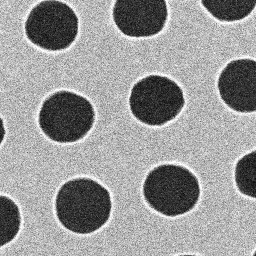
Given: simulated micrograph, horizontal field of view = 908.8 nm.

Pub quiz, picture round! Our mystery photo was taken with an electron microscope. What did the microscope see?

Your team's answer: holes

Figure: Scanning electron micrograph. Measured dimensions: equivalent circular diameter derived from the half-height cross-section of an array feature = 0.191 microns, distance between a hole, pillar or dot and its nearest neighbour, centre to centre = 90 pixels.